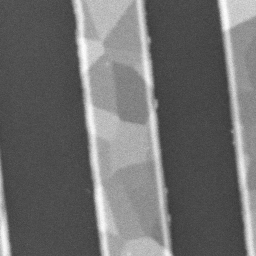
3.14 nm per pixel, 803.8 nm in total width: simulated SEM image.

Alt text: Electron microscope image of one or a few lines or trenches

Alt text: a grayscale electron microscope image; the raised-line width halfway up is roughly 191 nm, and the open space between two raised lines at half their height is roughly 0.264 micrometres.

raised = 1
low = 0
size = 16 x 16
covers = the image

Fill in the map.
0000011110000011
0000011110000011
0000011110000011
0000011110000011
0000011110000011
0000011110000001
0000001110000001
0000001111000001
0000001111000001
0000001111000001
0000001111000001
0000001111000001
0000001111000001
0000001111000001
0000001111000000
0000000111000000